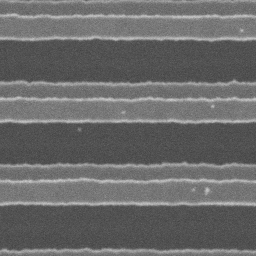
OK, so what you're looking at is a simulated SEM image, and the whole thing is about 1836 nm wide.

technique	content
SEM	lines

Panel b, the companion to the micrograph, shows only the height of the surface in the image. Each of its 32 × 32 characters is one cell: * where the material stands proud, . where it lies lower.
********************************
********************************
********************************
********************************
********************************
................................
................................
................................
................................
................................
**************.***********.*****
********************************
********************************
********************************
********************************
................................
................................
................................
................................
................................
......................*.........
********************************
********************************
********************************
********************************
********************************
................................
................................
................................
................................
................................
********************************